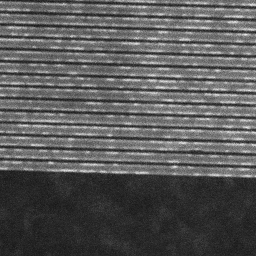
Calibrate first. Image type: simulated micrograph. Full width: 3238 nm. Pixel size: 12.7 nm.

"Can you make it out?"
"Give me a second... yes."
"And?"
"parallel lines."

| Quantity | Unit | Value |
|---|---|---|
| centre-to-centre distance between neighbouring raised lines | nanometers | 155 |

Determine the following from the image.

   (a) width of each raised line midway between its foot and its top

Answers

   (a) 104 nanometres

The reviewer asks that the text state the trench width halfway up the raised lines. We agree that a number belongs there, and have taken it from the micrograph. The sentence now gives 47.4 nanometres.